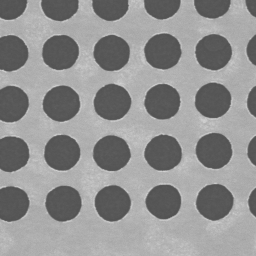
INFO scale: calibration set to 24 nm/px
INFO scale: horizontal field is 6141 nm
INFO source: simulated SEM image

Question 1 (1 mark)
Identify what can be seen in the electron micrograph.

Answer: a regular array of holes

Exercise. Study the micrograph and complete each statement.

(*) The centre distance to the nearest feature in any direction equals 1180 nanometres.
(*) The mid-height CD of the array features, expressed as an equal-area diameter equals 874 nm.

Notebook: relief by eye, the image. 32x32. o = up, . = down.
...oo.....o.....oo.....o.....oo.
...oo.....oo....oo....ooo...ooo.
ooooooo.ooooo..ooooooooooooooooo
oooooooooooooooooooooooooooooooo
o.ooooo..oooo..oooo...oooo..oooo
...oo.....oo....oo....ooo....oo.
....o.....oo....oo.....o.....oo.
...oo.....oo....oo....ooo....oo.
...ooo...oooo..ooooo.ooooo..oooo
oooooooooooooooooooooooooooooooo
oooooooooooooooooooo.ooooo..oooo
...ooo...ooo....oo....ooo....oo.
....o.....oo....oo.....o.....oo.
....o.....oo....oo....oo.....oo.
...ooo...ooo...oooo...oooo..oooo
oooooooooooooooooooooooooooooooo
oooooooooooooooooooooooooooooooo
...ooo...ooo....ooo...ooo....oo.
....oo....oo....oo.....oo....oo.
....oo....oo....oo.....oo....oo.
...ooo....oo....ooo...ooo...oooo
oooooooooooooooooooooooooooooooo
oooooooooooooooooooooooooooooooo
..ooooo..oooo..oooo...ooo...oooo
...ooo....oo....oo.....oo....oo.
....oo....oo....oo.....o.....oo.
...ooo....oo....ooo...ooo....oo.
..ooooo..oooo..ooooooooooo.ooooo
oooooooooooooooooooooooooooooooo
oooooooooooooooooooooooooooooooo
oooooooooooooooooooooooooooooooo
oooooooooooooooooooooooooooooooo